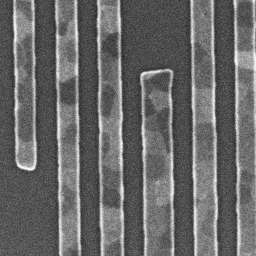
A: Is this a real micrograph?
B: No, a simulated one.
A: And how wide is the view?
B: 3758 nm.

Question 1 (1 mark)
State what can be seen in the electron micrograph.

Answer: wiring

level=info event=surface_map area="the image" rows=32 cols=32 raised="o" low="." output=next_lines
..oo...ooo..ooo.........ooo..ooo
..oo...ooo..ooo.........ooo..ooo
..oo...ooo..ooo.........ooo..ooo
..oo...ooo..ooo.........ooo..ooo
..oo...ooo..ooo.........ooo..ooo
..oo...ooo..ooo.........ooo..ooo
..oo...ooo..ooo.........ooo..ooo
..oo...ooo..ooo.........ooo..ooo
..oo...ooo..ooo.........ooo...oo
..oo...ooo..ooo...ooo...ooo...oo
..oo...ooo..ooo...ooo...ooo...oo
..oo...ooo..ooo...ooo...ooo...oo
..oo...ooo..ooo...ooo...ooo...oo
..oo...ooo..ooo...ooo...ooo...oo
..oo...ooo..ooo...ooo...ooo...oo
..oo...ooo..ooo...ooo...ooo...oo
..oo...ooo...oo...ooo...ooo...oo
..oo...ooo..ooo...ooo...ooo...oo
..oo...ooo..ooo...ooo...ooo...oo
..oo...ooo..ooo...ooo...ooo...oo
..oo...ooo..ooo...ooo...ooo...oo
.......ooo..ooo...ooo...ooo...oo
.......ooo...oo...oooo..ooo...oo
.......ooo...oo...oooo..ooo...oo
.......ooo...oo...oooo..ooo...oo
........oo...oo...ooo...ooo...oo
........oo...oo...oooo..ooo...oo
........oo...oo...oooo..ooo...oo
........oo...oo...oooo..ooo...oo
........oo...oo...oooo..ooo...oo
........oo...oo...oooo..ooo...oo
........oo...oo...oooo..ooo...oo